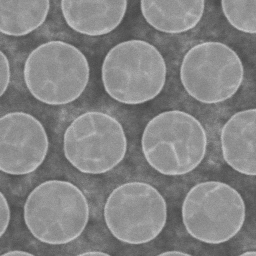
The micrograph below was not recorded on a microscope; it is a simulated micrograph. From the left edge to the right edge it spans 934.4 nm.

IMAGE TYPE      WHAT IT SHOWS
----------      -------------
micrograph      a regular array of raised bodies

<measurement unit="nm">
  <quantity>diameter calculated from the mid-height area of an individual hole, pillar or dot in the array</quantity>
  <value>229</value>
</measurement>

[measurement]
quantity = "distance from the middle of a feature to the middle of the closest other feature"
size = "284 nanometers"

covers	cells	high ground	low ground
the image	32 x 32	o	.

oooooo..oooooooo..ooooooo...oooo
oooooo..ooooooo...ooooooo...oooo
ooooo...ooooooo...ooooooo....ooo
oooo.....ooooo.....ooooo......oo
................................
......oo.......oooo......ooo....
....oooooo....oooooo....ooooo...
o..oooooooo..ooooooo...ooooooo..
o..oooooooo..oooooooo..ooooooo..
o..oooooooo..oooooooo..ooooooo..
o..oooooooo..ooooooo...ooooooo..
....oooooo....oooooo....ooooo...
.....oooo......ooo.......ooo....
................................
.ooo......ooo.......oooo.....ooo
ooooo....oooooo....oooooo...oooo
oooooo..ooooooo...ooooooo...oooo
oooooo..oooooooo..oooooooo..oooo
oooooo..oooooooo..oooooooo..oooo
oooooo..ooooooo...ooooooo...oooo
ooooo....oooooo....oooooo....ooo
.ooo.......oo.......oooo......oo
................................
.....ooooo.....oooo.....ooooo...
....oooooo....oooooo...ooooooo..
o..oooooooo..oooooooo..ooooooo..
o..oooooooo..oooooooo..oooooooo.
o..oooooooo..oooooooo..ooooooo..
o...oooooo....oooooo...ooooooo..
....oooooo....ooooo.....ooooo...
................................
..o..................o..........